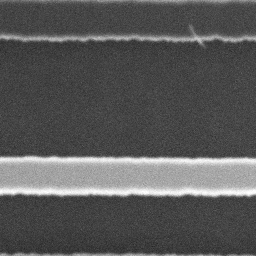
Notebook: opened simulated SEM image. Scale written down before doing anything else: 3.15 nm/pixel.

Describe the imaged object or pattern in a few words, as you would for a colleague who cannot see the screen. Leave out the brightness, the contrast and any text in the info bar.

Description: lines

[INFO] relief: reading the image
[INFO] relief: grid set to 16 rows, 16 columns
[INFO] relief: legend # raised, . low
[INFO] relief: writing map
################
################
...#.......##.#.
................
................
................
................
................
................
................
################
################
................
................
................
................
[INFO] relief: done